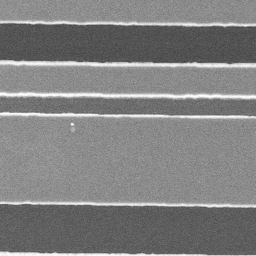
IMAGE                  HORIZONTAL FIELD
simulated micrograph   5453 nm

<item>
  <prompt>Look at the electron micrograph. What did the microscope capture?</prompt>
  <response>lines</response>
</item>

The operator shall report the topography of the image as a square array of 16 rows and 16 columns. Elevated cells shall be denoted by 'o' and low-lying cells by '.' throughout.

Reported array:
oooooooooooooooo
...........ooooo
................
................
oooooooooooooooo
oooooooooooooooo
oooooooooooooooo
oooooooooooooooo
oooooooooooooooo
oooooooooooooooo
oooooooooooooooo
oooooooooooooooo
oooooooooooooooo
................
................
................